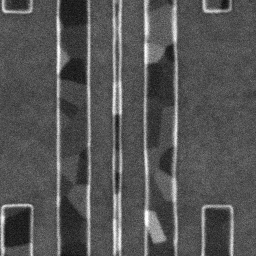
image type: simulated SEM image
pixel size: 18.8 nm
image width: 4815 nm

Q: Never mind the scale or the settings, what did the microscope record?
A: wiring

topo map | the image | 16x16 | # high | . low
##..##...##..#..
....##...##.....
....##...##.....
....##...##.....
....##...##.....
....##...##.....
....##...##.....
....##...##.....
....##...##.....
....##...##.....
....##...##.....
....##...##.....
....##...##.....
##..##...##..##.
##..##...##..##.
##..##...##..##.